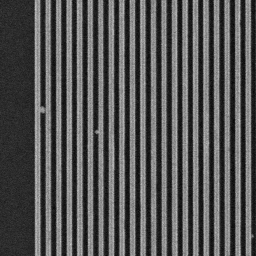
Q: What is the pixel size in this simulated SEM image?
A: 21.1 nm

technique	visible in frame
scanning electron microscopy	parallel lines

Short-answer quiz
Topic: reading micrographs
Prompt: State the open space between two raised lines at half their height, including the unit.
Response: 145 nanometers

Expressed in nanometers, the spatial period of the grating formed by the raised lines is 222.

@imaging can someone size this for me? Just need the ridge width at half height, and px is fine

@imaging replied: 4.25